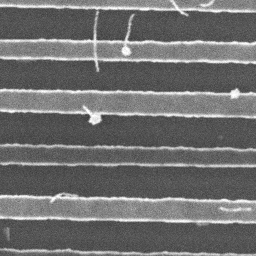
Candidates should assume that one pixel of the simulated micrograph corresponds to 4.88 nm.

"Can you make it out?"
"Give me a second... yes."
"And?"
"lines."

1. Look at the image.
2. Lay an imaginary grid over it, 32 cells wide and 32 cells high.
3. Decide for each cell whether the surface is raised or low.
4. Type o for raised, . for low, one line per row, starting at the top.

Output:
oooooooooooooooooooooooooooooooo
................................
................................
................................
................................
oooooooooooooooooooooooooooooooo
oooooooooooooooooooooooooooooooo
...........ooooooooooooooooooooo
................................
................................
................................
ooooooooooooooooooo....o.....o..
oooooooooooooooooooooooooooooooo
oooooooooooooooooooooooooooooooo
...........oo..........o.ooooooo
................................
................................
................................
oooooooooooooooooo..ooo.........
oooooooooooooooooooooooooooooooo
o.oooooooooooooooooooooooooooooo
................................
................................
................................
oooo............................
oooooooooooooooooooooooooooooooo
oooooooooooooooooooooooooooooooo
...............ooooooooooooooooo
................................
................................
................................
oooooooooo......................